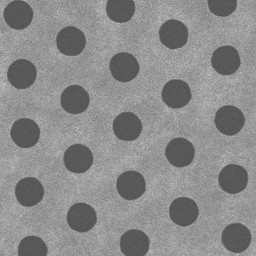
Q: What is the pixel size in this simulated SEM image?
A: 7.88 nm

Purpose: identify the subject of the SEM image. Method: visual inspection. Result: a regular array of holes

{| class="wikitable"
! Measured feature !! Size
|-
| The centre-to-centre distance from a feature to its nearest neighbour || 462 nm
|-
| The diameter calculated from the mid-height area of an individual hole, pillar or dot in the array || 29.7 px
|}